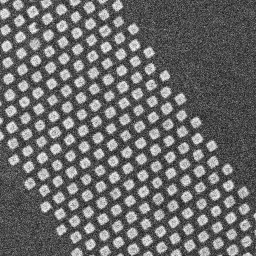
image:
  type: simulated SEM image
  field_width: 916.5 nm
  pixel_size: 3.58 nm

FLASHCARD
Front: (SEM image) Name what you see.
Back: a regular array of raised bodies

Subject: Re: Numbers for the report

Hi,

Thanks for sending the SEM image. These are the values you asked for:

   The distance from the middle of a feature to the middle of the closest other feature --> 57.5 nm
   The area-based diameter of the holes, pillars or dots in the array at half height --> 9.16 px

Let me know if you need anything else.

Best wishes